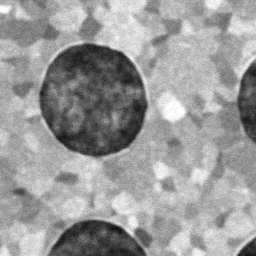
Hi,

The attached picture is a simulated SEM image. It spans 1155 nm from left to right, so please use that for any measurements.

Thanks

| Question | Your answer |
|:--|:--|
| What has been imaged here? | holes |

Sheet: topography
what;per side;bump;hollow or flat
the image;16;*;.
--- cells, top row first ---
****************
****************
****************
***.....********
***......******.
***......******.
**.......******.
***......******.
***......******.
*****..*********
****************
****************
****************
****************
****....********
***......******.